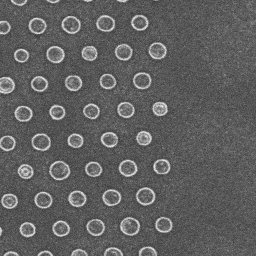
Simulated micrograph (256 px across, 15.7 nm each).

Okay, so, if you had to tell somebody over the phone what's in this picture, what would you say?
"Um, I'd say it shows a regular array of raised bodies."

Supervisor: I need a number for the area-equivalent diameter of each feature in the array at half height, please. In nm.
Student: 237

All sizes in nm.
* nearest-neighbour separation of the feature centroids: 523